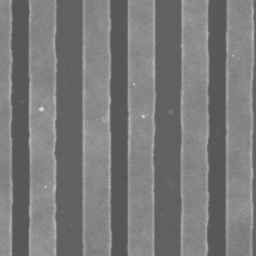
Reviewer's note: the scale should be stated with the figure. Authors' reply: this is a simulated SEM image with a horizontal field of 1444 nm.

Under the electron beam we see lines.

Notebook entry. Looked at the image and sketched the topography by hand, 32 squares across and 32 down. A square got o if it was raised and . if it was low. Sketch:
o...ooo...oooo..ooo....ooo..oooo
o...ooo...oooo..ooo....ooo..oooo
oo..ooo...oooo..ooo....ooo..oooo
o...ooo...oooo..ooo....ooo..oooo
o...ooo...oooo..ooo....ooo..oooo
o...ooo...oooo..ooo....ooo..oooo
o...ooo...oooo..ooo....ooo..oooo
oo..ooo...oooo..ooo....ooo..oooo
o...ooo...oooo..ooo....ooo..oooo
o...ooo...oooo..ooo....ooo..oooo
o...ooo...oooo..ooo....ooo..oooo
o...ooo...oooo..ooo....ooo..ooo.
o...ooo...oooo..ooo....ooo..oooo
o...ooo...oooo..ooo....ooo..oooo
o...ooo...oooo..ooo....ooo..oooo
o...ooo...oooo..ooo....ooo..oooo
o...ooo...oooo..ooo....ooo..oooo
o...ooo...oooo..ooo....ooo..oooo
oo..ooo...oooo..ooo....ooo..ooo.
o...ooo...oooo..ooo....ooo..ooo.
o...ooo...oooo..ooo....ooo..ooo.
o...ooo...oooo..ooo....ooo..oooo
oo..ooo...oooo..ooo....ooo..oooo
oo..ooo...oooo..ooo....ooo..ooo.
oo..ooo...oooo..ooo....ooo..ooo.
oo..ooo...oooo..ooo....ooo..oooo
o...ooo...oooo..ooo....ooo..oooo
o...ooo...oooo..ooo....ooo..oooo
o...ooo...oooo..ooo....ooo..oooo
o...ooo...oooo..ooo....ooo..ooo.
o...ooo...oooo..ooo....ooo..ooo.
o...ooo...oooo..ooo....ooo..ooo.